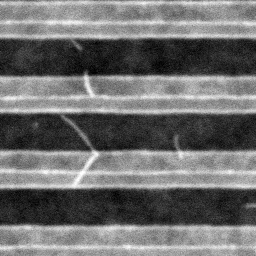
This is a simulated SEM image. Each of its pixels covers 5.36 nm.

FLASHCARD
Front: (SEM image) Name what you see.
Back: lines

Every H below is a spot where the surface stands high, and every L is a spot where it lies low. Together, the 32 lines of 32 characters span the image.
HHHHHHHHHHHHHHHHHHHHHHHHHHHHHHHH
HHHHHHHHHHHHHHHHHHHHHHHHHHHHHHHH
HHHHHHHHHHHHHHHHHHHHHHHHHHHHHHHH
HHHHHHHHHHHHHHHHHHHHHHHHHHHHHHHH
HHHHHHHHHHHHHHHHHHHHHHHHHHHHHHHH
LLLLLLLLLLLLLLLLLLLLLLLLLLLLLLLL
LLLLLLLLLLLLLLLLLLLLLLLLLLLLLLLL
LLLLLLLLLLLLLLLLLLLLLLLLLLLLLLLL
LLLLLLLLLLLLLLLLLLLLLLLLLLLLLLLL
LLLLLLLLLLLLLLLLLLLLLLLLLLLLLLLL
HHHHHHHHHHHHHHHHHHHHHHHHHHHHHHHH
HHHHHHHHHHHHHHHHHHHHHHHHHHHHHHHH
HHHHHHHHHHHHHHHHHHHHHHHHHHHHHHHH
HHHHHHHHHHHHHHHHHHHHHHHHHHHHHHHH
LLLLLLLLLLLLLLLLLLLLLLLLLLLLLLLL
LLLLLLLLLLLLLLLLLLLLLLLLLLLLLLLL
LLLLLLLLLLLLLLLLLLLLLLLLLLLLLLLL
LLLLLLLLLLLLLLLLLLLLLLLLLLLLLLLL
LLLLLLLLLLLLLLLLLLLLLLLLLLLLLLLL
HHHHHHHHHHHHHHHHHHHHHHHHHHHHHHHH
HHHHHHHHHHHHHHHHHHHHHHHHHHHHHHHH
HHHHHHHHHHHHHHHHHHHHHHHHHHHHHHHH
HHHHHHHHHHHHHHHHHHHHHHHHHHHHHHHH
LLLLLLLLLLLLLLLLLLLLLLLLLLLLLLLL
LLLLLLLLLLLLLLLLLLLLLLLLLLLLLLLL
LLLLLLLLLLLLLLLLLLLLLLLLLLLLLLLL
LLLLLLLLLLLLLLLLLLLLLLLLLLLLLLLL
LLLLLLLLLLLLLLLLLLLLLLLLLLLLLLLL
LHHHHLLLLLLLLLHHHLLLLLLLLLLLLLLL
HHHHHHHHHHHHHHHHHHHHHHHHHHHHHHHH
HHHHHHHHHHHHHHHHHHHHHHHHHHHHHHHH
HHHHHHHHHHHHHHHHHHHHHHHHHHHHHHHH